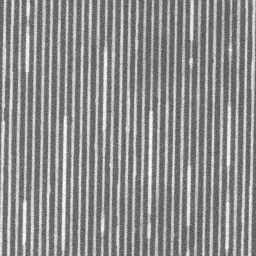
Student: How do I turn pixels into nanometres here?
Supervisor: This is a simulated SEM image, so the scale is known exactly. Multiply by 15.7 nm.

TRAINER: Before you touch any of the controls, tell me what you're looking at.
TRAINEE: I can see parallel lines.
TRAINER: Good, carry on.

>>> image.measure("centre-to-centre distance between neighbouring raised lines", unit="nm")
122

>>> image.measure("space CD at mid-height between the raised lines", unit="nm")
92.1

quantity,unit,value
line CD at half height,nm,33.3